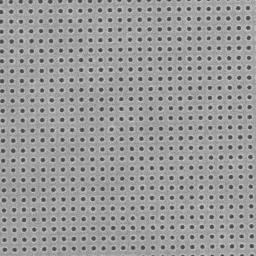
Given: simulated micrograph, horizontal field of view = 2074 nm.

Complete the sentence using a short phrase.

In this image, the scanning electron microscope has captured a regular array of holes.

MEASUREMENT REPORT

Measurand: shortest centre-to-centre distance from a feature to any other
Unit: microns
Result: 0.0783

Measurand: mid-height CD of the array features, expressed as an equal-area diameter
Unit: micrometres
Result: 0.0329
